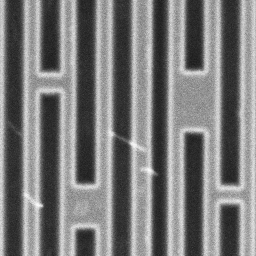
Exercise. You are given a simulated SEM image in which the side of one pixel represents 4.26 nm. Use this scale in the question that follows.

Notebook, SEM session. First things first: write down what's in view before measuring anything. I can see parallel lines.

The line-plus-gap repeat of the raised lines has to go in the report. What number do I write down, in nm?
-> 154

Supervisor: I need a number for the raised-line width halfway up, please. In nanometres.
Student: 77.2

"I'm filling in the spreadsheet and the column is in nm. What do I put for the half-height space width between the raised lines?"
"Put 77.2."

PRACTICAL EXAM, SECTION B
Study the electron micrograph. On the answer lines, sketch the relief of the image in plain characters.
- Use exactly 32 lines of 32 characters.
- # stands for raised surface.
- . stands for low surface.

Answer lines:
#..##...##..##..###..##...##..##
#..##...##..##..###..##...##..##
#..##..###..##..###..##...##..##
#..##..###..##..###..##...##..##
#..##...##..##..###..##...##..##
#..##...##..##..###..##...##..##
#..##...##..##..###..##...##..##
#..##...##..##..###..##...##..##
#..##...##..##..###..##..###..##
#..#######..##..###..#######..##
#..#######..##..###..#######..##
#..#######..##..###..#######..##
#..##...##..##..###..#######..##
#..##...##..##..###..#######..##
#..##..###..##..###..#######..##
#..##..###..##..###..#######..##
#..##..###..##..###..#######..##
...##..###..##..###..##..###..##
...##..###..##..###..##..###..##
...##..###..##..###..##..###..##
...##..###..##..###..##..###..##
...##..##...##..###..##..###..##
#..##..##...##..###..##..###..##
...##..#######..###..##..#######
#..##..#######..###..##..#######
#..##..#######..###..##..###.###
#..##..#######..###..##..##...##
#..##..#######..###..##..##...##
#..##..#######..###..##..##...##
#..##..##...##..###..##..##...##
#..##..##...##..###..##..##...##
#..##..##...##..###..##..##...##